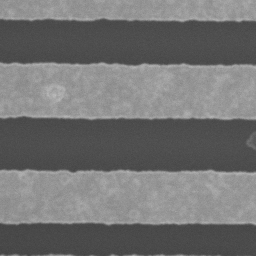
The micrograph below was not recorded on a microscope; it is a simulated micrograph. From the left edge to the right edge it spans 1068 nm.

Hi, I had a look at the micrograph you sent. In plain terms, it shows lines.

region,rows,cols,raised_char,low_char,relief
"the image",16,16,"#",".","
################
................
................
................
################
################
################
................
................
................
................
################
################
################
................
................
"